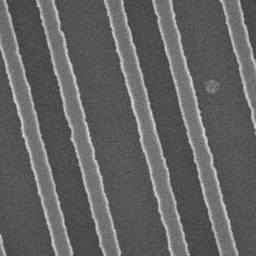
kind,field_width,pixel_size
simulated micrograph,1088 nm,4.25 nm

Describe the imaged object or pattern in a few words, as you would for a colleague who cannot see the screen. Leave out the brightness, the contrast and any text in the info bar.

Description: lines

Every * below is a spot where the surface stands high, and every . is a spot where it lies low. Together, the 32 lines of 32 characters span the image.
*....**......**....***......**..
*....**......***...***......**..
*....**.......**....**......**..
**....**......**....**.......**.
**....**......**....***......**.
**....**......***....**......**.
**....**.......**....**......***
***....**......**....**.......**
.**....**......**....**.......**
.**....**.......**....**......**
.***...***......**....**......**
..**....**......**....**.......*
..**....**......***...***......*
..**....**.......**....**......*
..***...***......**....**......*
...**....**......**....**.......
...**....**......***...***......
...**....**.......**....**......
...***...***......**....**......
....**....**......**....***.....
....**....**.......**...***.....
....**....**.......**....**.....
....***...***......**....**.....
.....**....**......**....**.....
.....**....**......***...***....
.....**....**.......**....**....
......**...***......**....**....
......**....**......***...***...
......**....**.......**....**...
......**....**.......**....**...
.......**...***......**....**...
*......**....**......***...***..